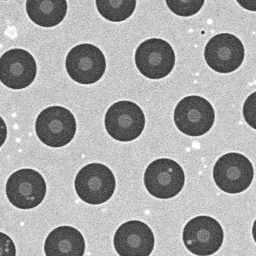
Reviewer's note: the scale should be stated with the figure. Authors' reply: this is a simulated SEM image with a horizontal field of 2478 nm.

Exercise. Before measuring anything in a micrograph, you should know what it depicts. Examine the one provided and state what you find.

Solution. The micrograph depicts an array of small figures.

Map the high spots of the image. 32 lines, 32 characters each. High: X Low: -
XXX-----XXXX-----XXXX----XXXXX--
XXX-----XXXX-----XXXXX---XXXXXXX
XXXX----XXXXX---XXXXXXXXXXXXXXXX
XXXXXXXXXXXXXXXXXXXXXXXXXXXXXXXX
XXXXXXXXXXXXXXXXXXXXXXXXXXX--XXX
XXXXXXXXXX-XXXXXX----XXXXX----XX
X---XXXXX----XXXX-----XXXX-----X
----XXXX-----XXXX-----XXXX----XX
-----XXX-----XXXX-----XXXX----XX
----XXXXX----XXXXX---XXXXXXXXXXX
----XXXXXX-XXXXXXXXXXXXXXXXXXXXX
XXXXXXXXXXXXXXXXXXXXXXXXXXXXXXXX
XXXXXXXXXXXXXXXXXXXXXXX---XXXXX-
XXXXXX--XXXXXX----XXXX-----XXX--
XXXXX----XXXX-----XXXX-----XXX--
-XXX------XXX-----XXXX-----XXXX-
-XXX-----XXXX-----XXXXX---XXXXXX
-XXXX----XXXXX---XXXXXXXXXXXXXXX
XXXXXXXXXXXXXXXXXXXXXXXXXXXXXXXX
XXXXXXXXXXXXXXXXXXXXXXXXXXXX---X
XXXXXXXXXXX--XXXXXX---XXXXX-----
XX---XXXXX----XXXX-----XXXX-----
X-----XXX-----XXXX-----XXXX-----
X-----XXX-----XXXX-----XXXX----X
X-----XXXX----XXXXX---XXXXXXXXXX
X----XXXXXX--XXXXXXXXXXXXXXXXXXX
XXXXXXXXXXXXXXXXXXXXXXXXXXXXXXXX
XXXXXXXXXXXXXXXXXXXXXXXX---XXXXX
XXXXXXX--XXXXXX----XXXX-----XXX-
-XXXXX----XXXX-----XXXX-----XXXX
--XXX------XXX-----XXXX-----XXXX
--XXXX-----XXXX----XXXXX---XXXXX